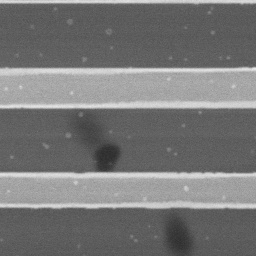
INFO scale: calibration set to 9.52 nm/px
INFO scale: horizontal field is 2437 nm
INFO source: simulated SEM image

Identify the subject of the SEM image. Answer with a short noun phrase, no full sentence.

lines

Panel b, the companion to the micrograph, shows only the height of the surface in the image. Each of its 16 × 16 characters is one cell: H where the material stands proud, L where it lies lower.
LLLLLLLLLLLLLLLL
LLLLLLLLLLLLLLLL
LLLLLLLLLLLLLLLL
LLLLLLLLLLLLLLLL
HHHHHHHHHHHHHHHH
HHHHHHHHHHHHHHHH
HHHHHHHHHHHHHHHH
LLLLLLLLLLLLLLLL
LLLLLLLLLLLLLLLL
LLLLLLLLLLLLLLLL
LLLLLLLLLLLLLLLL
HHHHHHHHHHHHHHHH
HHHHHHHHHHHHHHHH
LLLLLLLLLLLLLLLL
LLLLLLLLLLLLLLLL
LLLLLLLLLLLLLLLL